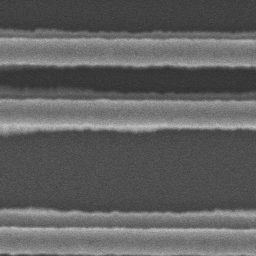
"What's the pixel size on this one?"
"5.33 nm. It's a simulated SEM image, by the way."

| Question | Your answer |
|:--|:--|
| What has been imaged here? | lines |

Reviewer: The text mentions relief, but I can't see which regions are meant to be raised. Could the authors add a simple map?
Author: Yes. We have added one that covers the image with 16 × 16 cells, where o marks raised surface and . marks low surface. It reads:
................
................
oooooooooooooooo
oooooooooooooooo
................
................
oooooooooooooooo
oooooooooooooooo
................
................
................
................
................
oooooooooooooooo
oooooooooooooooo
oooooooooooooooo